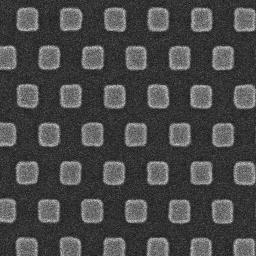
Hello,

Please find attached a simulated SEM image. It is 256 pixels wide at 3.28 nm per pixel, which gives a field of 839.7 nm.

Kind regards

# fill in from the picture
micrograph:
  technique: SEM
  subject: a regular array of raised bodies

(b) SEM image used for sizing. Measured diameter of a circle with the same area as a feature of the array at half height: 0.0795 um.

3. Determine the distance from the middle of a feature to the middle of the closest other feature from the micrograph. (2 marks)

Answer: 142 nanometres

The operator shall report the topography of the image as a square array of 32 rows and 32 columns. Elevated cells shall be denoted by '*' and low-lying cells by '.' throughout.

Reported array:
................................
..***...**...***...**...**...***
..***..***...***...**...**...***
..***...**...***...**...**...***
................................
................................
**...**...***...**...***...**...
**...**...***...**...***...**...
**...**....*....**...**....**...
................................
................................
..***...**...***..***...**...***
..***...**...***..***...**...***
...................*..........*.
................................
**...**....*................*...
**...**...***...**...***...**...
**...**...***...**...***...**...
................................
................................
..***...**...**....**...**...***
..***...**...***..***...**...***
..***...**...**...***...***..***
................................
................................
**...**...***...**...***...**...
**...**...***...**...***...**...
**...**...***...**...***...**...
................................
................................
..***...**...***..***...**...***
..***...**...***..***...**...***